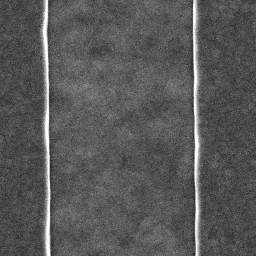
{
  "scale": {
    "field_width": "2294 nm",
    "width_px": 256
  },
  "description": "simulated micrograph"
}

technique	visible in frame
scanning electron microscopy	wiring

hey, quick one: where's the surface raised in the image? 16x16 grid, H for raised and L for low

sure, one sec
HHHLLLLLLLLLHHHH
HHHLLLLLLLLLHHHH
HHHLLLLLLLLLHHHH
HHHLLLLLLLLLHHHH
HHHLLLLLLLLLHHHH
HHHLLLLLLLLLHHHH
HHHLLLLLLLLLHHHH
HHHLLLLLLLLLHHHH
HHHLLLLLLLLLHHHH
HHHLLLLLLLLLHHHH
HHHLLLLLLLLLHHHH
HHHLLLLLLLLLHHHH
HHHLLLLLLLLLHHHH
HHHLLLLLLLLLHHHH
HHHLLLLLLLLLHHHH
HHHLLLLLLLLLHHHH